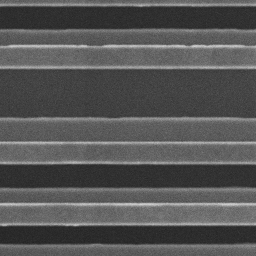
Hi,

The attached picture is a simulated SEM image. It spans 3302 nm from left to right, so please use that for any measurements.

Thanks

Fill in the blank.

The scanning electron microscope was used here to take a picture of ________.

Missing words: lines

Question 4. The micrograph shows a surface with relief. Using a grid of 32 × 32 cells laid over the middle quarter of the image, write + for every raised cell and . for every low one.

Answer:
++++++++++++++++++++++++++++++++
................................
................................
................................
................................
................................
................................
................................
................................
................................
................................
................................
................................
................................
++++++++++++++++++++++++++++++++
++++++++++++++++++++++++++++++++
++++++++++++++++++++++++++++++++
++++++++++++++++++++++++++++++++
++++++++++++++++++++++++++++++++
++++++++++++++++++++++++++++++++
++++++++++++++++++++++++++++++++
++++++++++++++++++++++++++++++++
++++++++++++++++++++++++++++++++
++++++++++++++++++++++++++++++++
++++++++++++++++++++++++++++++++
................................
................................
................................
................................
................................
................................
++++++++++++++++++++++++++++++++